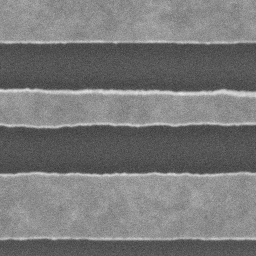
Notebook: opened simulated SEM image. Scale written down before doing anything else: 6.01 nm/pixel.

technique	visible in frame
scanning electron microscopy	lines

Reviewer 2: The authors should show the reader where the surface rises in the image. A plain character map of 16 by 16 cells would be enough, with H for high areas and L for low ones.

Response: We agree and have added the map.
HHHHHHHHHHHHHHHH
HHHHHHHHHHHHHHHH
HHHHHHHHHHHHHHHH
LLLLLLLLLLLLLLLL
LLLLLLLLLLLLLLLL
LLLLLLLLLLLLLLLL
HHHHHHHHHHHHHHHH
HHHHHHHHHHHHHHHH
LLLLLLLLLLLLLLLL
LLLLLLLLLLLLLLLL
LLLLLLLLLLLLLLLL
HHHHHHHHHHHHHHHH
HHHHHHHHHHHHHHHH
HHHHHHHHHHHHHHHH
HHHHHHHHHHHHHHHH
LLLLLLLLLLLLLLLL